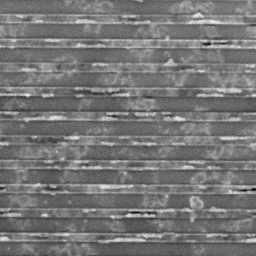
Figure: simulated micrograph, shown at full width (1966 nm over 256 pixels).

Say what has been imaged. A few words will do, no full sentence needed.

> parallel lines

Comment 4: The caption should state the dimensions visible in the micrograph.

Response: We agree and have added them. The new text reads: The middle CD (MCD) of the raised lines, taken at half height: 7.86 pixels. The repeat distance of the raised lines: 186 nanometres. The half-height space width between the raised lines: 121 nm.